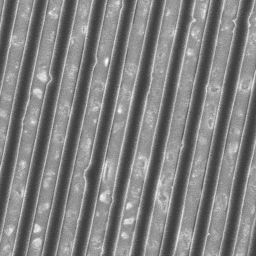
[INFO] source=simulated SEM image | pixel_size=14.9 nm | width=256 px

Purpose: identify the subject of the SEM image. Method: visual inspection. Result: parallel lines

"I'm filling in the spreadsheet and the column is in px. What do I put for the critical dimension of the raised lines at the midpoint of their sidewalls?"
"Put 14.5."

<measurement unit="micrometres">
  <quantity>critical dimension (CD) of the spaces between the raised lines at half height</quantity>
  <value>0.215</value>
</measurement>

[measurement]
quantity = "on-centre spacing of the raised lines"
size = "430 nm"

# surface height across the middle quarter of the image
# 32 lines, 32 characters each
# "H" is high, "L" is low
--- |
LLLLHHHHLLLHHHHLLLLHHHLLLLHHHHLL
LLLLHHHLLLLHHHHLLLLHHHLLLLHHHLLL
LLLLHHHLLLLHHHHLLLHHHHLLLLHHHLLL
LLLHHHHLLLLHHHLLLLHHHHLLLHHHHLLL
LLLHHHHLLLLHHHLLLLHHHHLLLHHHHLLL
LLLHHHHLLLHHHHLLLLHHHHLLLHHHLLLL
LLLHHHLLLLHHHHLLLHHHHLLLLHHHLLLL
LLLHHHLLLLHHHHLLLHHHHLLLLHHHLLLL
LLHHHHLLLLHHHLLLLHHHHLLLLHHHLLLL
LLHHHHLLLLHHHLLLLHHHHLLLHHHHLLLH
LLHHHHLLLHHHHLLLLHHHLLLLHHHLLLLL
LLHHHLLLLHHHHLLLHHHHLLLLHHHLLLLH
LLHHHLLLLHHHHLLLHHHHLLLLHHHLLLLH
LHHHHLLLLHHHLLLLHHHHLLLLHHHLLLLH
LHHHHLLLLHHHLLLLHHHHLLLHHHHLLLLH
LHHHHLLLHHHHLLLHHHHLLLLHHHLLLLHH
LHHHLLLLHHHHLLLHHHHLLLLHHHHLLLHH
LHHHLLLLHHHHLLLHHHHLLLHHHHLLLLHH
HHHHLLLLHHHLLLLHHHHLLLHHHHLLLLHH
HHHHLLLLHHHLLLLHHHHLLLHHHHLLLLHH
HHHHLLLHHHHLLLHHHHLLLLHHHLLLLLHH
HHHLLLLHHHHLLLHHHHLLLLHHHLLLLHHH
HHHLLLLHHHHLLLHHHHLLLLHHHLLLLHHH
HHHLLLLHHHLLLLHHHHLLLLHHHLLLLHHH
HHHLLLLHHHLLLLHHHHLLLHHHHLLLHHHH
HHHLLLHHHHLLLHHHHLLLLHHHHLLLHHHH
HHLLLHHHHHLLLHHHHLLLLHHHHLLLHHHH
HHLLLHHHHHLLLHHHHLLLHHHHLLLLHHHL
HHLLLHHHHLLLLHHHLLLLHHHHLLLLHHHL
HLLLLHHHHLLLLHHHLLLLHHHHLLLHHHHL
HLLLLHHHHLLLHHHHLLLLHHHLLLLHHHHL
HLLLLHHHHLLLHHHHLLLLHHHLLLLHHHHL